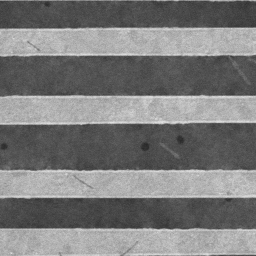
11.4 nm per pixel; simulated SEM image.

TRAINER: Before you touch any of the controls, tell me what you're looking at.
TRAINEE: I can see lines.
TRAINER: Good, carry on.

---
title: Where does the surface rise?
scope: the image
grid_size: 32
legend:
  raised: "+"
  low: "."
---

................................
................................
................................
................................
++++++++++++++++++++++++++++++++
++++++++++++++++++++++++++++++++
++++++++++++++++++++++++++++++++
................................
................................
................................
................................
................................
++++++++++++++++++++++++++++++++
++++++++++++++++++++++++++++++++
++++++++++++++++++++++++++++++++
................................
................................
................................
................................
................................
................................
++++++++++++++++++++++++++++++++
++++++++++++++++++++++++++++++++
++++++++++++++++++++++++++++++++
++++++++++++++++++++++++++++++++
................................
................................
................................
................................
++++++++++++++++++++++++++++++++
++++++++++++++++++++++++++++++++
++++++++++++++++++++++++++++++++